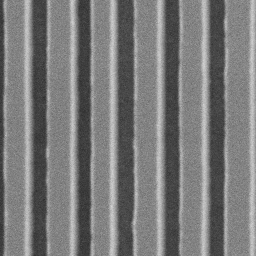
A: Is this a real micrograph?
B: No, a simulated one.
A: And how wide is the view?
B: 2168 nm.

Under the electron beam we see lines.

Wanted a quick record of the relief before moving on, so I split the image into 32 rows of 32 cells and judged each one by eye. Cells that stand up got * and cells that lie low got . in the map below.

.***..***..***...***..****..****
.***..***..***...***..****..****
.***..***..***...***...***..****
.***..***..***...***...***..****
.***..***..***...***...***..****
.***..***..***...***...***..****
.***..***..***...***..****..****
.***..***..***...***...***..****
.***..***..***...***..****..****
.***..***..***...***..****..****
.***..***..***...***..****..****
.***..***..***...***..****..****
.***..***..***...***..****..****
.***..***..***...***..****..****
.***..***..***...***..****..****
.***..***..***...***..****..****
.***..***..***...***...***..****
.***..***...**...***...***..****
.***..***...**...***...***..****
.***..***..***...***...***..****
.***..***..***...***...***..****
.***..***..***...***...***..****
.***..***..***...***...***..****
.***..***..***...***...***..****
.***..***..***...***...***..****
.***..***..***...***...***..****
.***..***..***...***..****..****
.***..***..***...***..****..****
.***..***..***...***...***..****
.***..***..***...***...***..****
.***..***..***...***..****..****
.***..***..***...***..****..****